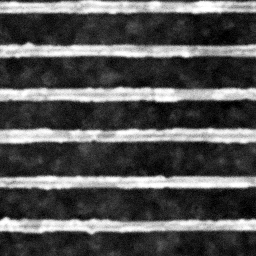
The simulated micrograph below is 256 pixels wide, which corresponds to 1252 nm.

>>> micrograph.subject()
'parallel lines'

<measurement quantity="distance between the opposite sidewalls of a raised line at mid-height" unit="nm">50.7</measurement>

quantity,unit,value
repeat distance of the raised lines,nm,214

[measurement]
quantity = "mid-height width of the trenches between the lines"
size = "162 nanometers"